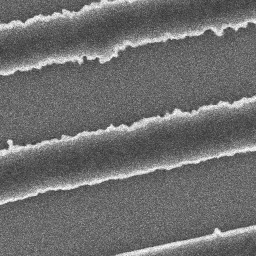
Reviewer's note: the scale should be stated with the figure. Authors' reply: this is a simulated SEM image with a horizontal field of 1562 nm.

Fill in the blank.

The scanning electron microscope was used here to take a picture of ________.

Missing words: one or a few lines or trenches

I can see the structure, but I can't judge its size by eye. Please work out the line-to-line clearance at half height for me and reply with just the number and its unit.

458 nanometers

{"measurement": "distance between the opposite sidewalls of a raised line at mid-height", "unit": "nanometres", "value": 305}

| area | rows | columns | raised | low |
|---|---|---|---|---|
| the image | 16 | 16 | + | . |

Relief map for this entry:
.....+++++++++++
+++++++++++++++.
++++++++++......
+++++++.........
+...............
................
..............++
.........+++++++
.....+++++++++++
+++++++++++++++.
++++++++++......
++++++..........
+...............
................
..............++
..........++++++